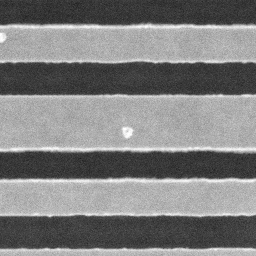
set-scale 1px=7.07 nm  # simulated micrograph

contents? lines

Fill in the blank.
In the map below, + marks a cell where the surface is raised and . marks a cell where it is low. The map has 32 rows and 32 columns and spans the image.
................................
................................
................................
++++++++++++++++++++++++++++++++
++++++++++++++++++++++++++++++++
++++++++++++++++++++++++++++++++
++++++++++++++++++++++++++++++++
++++++++++++++++++++++++++++++++
................................
................................
................................
................................
++++++++++++++++++++++++++++++++
++++++++++++++++++++++++++++++++
++++++++++++++++++++++++++++++++
++++++++++++++++++++++++++++++++
++++++++++++++++++++++++++++++++
++++++++++++++++++++++++++++++++
++++++++++++++++++++++++++++++++
................................
................................
................................
..............+++......+++..++.+
++++++++++++++++++++++++++++++++
++++++++++++++++++++++++++++++++
++++++++++++++++++++++++++++++++
++++++++++++++++++++++++++++++++
................................
................................
................................
................................
++++++++++++++++++++++++++++++++